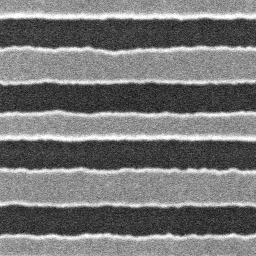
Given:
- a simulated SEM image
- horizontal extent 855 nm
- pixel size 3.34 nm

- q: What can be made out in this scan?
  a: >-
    lines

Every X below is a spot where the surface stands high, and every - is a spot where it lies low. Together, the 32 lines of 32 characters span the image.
XXXXXXXXXXXXXXXXXXXXXXXXXXXXXXXX
XXXXXXXXXXXXXXXXXXXXXXXXXXXXXXXX
--------------------------------
--------------------------------
--------------------------------
--------------------------------
XXXXXXXXXXXXXXXXXXXXXXXXXXXXXXXX
XXXXXXXXXXXXXXXXXXXXXXXXXXXXXXXX
XXXXXXXXXXXXXXXXXXXXXXXXXXXXXXXX
XXXXXXXXXXXXXXXXXXXXXXXXXXXXXXXX
XX------------------------------
--------------------------------
--------------------------------
--------------------------------
XXXXXXXXXXXXXXXXXXXXXXXXXXXXXXXX
XXXXXXXXXXXXXXXXXXXXXXXXXXXXXXXX
XXXXXXXXXXXXXXXXXXXXXXXXXXXXXXXX
-------XXXX-------------------XX
--------------------------------
--------------------------------
--------------------------------
XXXXXXXXXXXXXXXXXXXXXXXXXXXXXXXX
XXXXXXXXXXXXXXXXXXXXXXXXXXXXXXXX
XXXXXXXXXXXXXXXXXXXXXXXXXXXXXXXX
XXXXXXXXXXXXXXXXXXXXXXXXXXXXXXXX
X-XXXXXXXXXXXXXXXXXXXXXXXXXXXXXX
--------------------------------
--------------------------------
--------------------------------
XXXX--X---XXXX-----XXX--X-X-XX-X
XXXXXXXXXXXXXXXXXXXXXXXXXXXXXXXX
XXXXXXXXXXXXXXXXXXXXXXXXXXXXXXXX